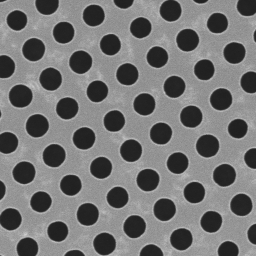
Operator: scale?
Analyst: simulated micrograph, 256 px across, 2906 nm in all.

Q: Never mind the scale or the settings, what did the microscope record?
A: a regular array of holes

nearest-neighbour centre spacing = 383 nm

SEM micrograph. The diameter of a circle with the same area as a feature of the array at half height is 0.255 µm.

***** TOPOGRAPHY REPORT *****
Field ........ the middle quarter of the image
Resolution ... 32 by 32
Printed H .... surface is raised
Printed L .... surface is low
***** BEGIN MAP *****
HLLLLLLHHHHHHHLLLLHHHHLLLHHHHHHH
HHLLLLHHHHHHHLLLLLHHHHHHHHHHHHHH
HHHHLHHHHHHHHLLLLLLHHHHHHHHHHHHH
HHHHHHHHHHHHHLLLLLLHHHHHHHLLLHHH
HHHHHHHLLLHHHHLLLLHHHHHHHLLLLLHH
HHHHHHLLLLLHHHHHHHHHHHHHHLLLLLHH
HHHHHHLLLLLHHHHHHHHHHHHHHLLLLLHH
HHHHHHLLLLLHHHHHHHHLLHHHHLLLLLHH
LLHHHHLLLLHHHHHHHHLLLLHHHHHHHHHH
LLLHHHHLLHHHHHHHHLLLLLLHHHHHHHHH
LLLLHHHHHHHHHHHHHLLLLLLHHHHHHHHL
LLLLHHHHHHHHHHHHHLLLLLLHHHHHHHLL
LLLHHHHHHHHLLLLHHHHLLLHHHHHHHLLL
LLHHHHHHHHLLLLLHHHHHHHHHHHHHHLLL
HHHHHHHHHHLLLLLHHHHHHHHHHHHHHLLL
HHHHHHHHHHLLLLLHHHHHHHLLLLHHHHLL
HHHLLLLHHHHLLLHHHHHHHHLLLLLHHHHH
HHLLLLLLHHHHHHHHHHHHHLLLLLLHHHHH
HHLLLLLLHHHHHHHHHHHHHHLLLLLHHHHH
HHLLLLLLHHHHHHHLLLHHHHLLLLHHHHHH
HHHLLLLHHHHHHHLLLLLHHHHHHHHHHHHH
HHHHHHHHHHHHHHLLLLLLHHHHHHHHHHHH
HHHHHHHHHHHHHHLLLLLHHHHHHHHLLLHH
HHHHHHHHLLLHHHHLLLLHHHHHHHLLLLLH
HHHHHHHLLLLLHHHHLHHHHHHHHHLLLLLH
HHHHHHLLLLLLHHHHHHHHHHHHHHLLLLLH
HHHHHHHLLLLLHHHHHHHLLLHHHHLLLLHH
HHHHHHHLLLLLHHHHHHLLLLLHHHHHLHHH
LLLLHHHHLLHHHHHHHHLLLLLLHHHHHHHH
LLLLHHHHHHHHHHHHHHLLLLLLHHHHHHHH
LLLLHHHHHHHHHHHHHHLLLLLHHHHHHHHL
LLLLHHHHHHHHLLLHHHHHLLHHHHHHHHLL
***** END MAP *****